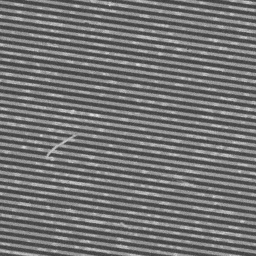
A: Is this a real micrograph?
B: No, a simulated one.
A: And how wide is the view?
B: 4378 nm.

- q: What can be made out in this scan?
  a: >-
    parallel lines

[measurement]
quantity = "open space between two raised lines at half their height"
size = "0.0782 micrometres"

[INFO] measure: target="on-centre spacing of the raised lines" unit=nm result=120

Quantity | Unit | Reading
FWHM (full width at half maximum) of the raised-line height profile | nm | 46.5